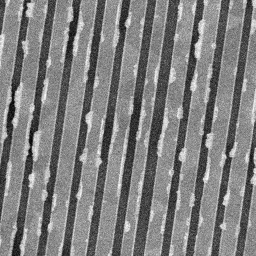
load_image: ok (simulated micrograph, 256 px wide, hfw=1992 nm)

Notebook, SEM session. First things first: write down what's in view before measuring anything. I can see parallel lines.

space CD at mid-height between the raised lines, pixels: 8.41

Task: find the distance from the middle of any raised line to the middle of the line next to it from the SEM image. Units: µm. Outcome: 0.191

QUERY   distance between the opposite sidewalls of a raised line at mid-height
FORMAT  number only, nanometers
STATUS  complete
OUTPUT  124